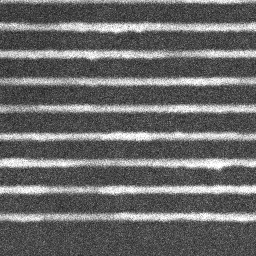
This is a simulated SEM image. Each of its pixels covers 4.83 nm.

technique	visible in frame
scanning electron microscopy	parallel lines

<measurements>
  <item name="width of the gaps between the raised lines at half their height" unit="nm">104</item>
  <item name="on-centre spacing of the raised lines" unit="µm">0.131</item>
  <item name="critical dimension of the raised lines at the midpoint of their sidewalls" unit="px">5.76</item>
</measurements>